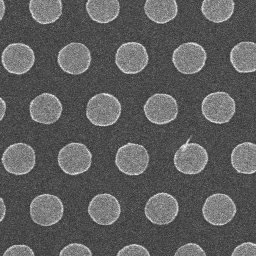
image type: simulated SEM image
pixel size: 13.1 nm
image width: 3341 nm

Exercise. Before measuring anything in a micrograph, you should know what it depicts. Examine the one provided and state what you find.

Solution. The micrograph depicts a regular array of raised bodies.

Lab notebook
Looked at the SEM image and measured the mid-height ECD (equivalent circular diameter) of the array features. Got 419 nanometers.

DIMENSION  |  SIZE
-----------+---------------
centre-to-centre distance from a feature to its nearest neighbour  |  0.747 µm